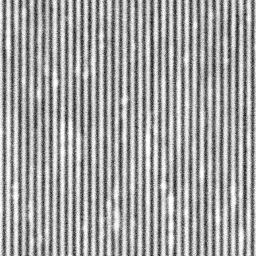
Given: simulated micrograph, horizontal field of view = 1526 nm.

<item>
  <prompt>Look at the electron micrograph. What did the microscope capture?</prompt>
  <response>parallel lines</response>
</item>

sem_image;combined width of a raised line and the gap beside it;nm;46.2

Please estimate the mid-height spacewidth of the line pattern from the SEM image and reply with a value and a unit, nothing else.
25.3 nanometers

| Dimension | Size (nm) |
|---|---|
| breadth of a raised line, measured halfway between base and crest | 20.9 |